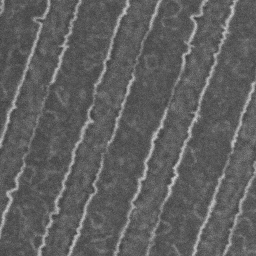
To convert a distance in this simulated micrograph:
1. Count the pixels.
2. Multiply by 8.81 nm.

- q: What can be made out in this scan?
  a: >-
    one or a few lines or trenches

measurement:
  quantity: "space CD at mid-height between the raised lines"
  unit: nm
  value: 234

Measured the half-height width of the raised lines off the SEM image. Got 394 nm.